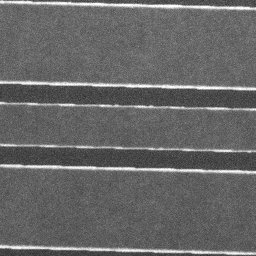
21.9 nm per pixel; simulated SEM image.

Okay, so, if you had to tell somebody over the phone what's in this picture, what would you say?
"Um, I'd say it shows lines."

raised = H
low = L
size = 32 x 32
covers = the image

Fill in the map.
HHHHHHHHHHHHLLLLLLLLLLLLLLLLLLLL
HHHHHHHHHHHHHHHHHHHHHHHHHHHHHHHH
HHHHHHHHHHHHHHHHHHHHHHHHHHHHHHHH
HHHHHHHHHHHHHHHHHHHHHHHHHHHHHHHH
HHHHHHHHHHHHHHHHHHHHHHHHHHHHHHHH
HHHHHHHHHHHHHHHHHHHHHHHHHHHHHHHH
HHHHHHHHHHHHHHHHHHHHHHHHHHHHHHHH
HHHHHHHHHHHHHHHHHHHHHHHHHHHHHHHH
HHHHHHHHHHHHHHHHHHHHHHHHHHHHHHHH
HHHHHHHHHHHHHHHHHHHHHHHHHHHHHHHH
LLLLLLLLHHHHHHHHHHHHHHHHHHHHHHHH
LLLLLLLLLLLLLLLLLLLLLLLLLLLLLLLL
LLLLLLLLLLLLLLLLLLLLLLLLLLLLLLLL
HHHHHHHHHHHHHHHHHHHHHHLLLLLLLLLL
HHHHHHHHHHHHHHHHHHHHHHHHHHHHHHHH
HHHHHHHHHHHHHHHHHHHHHHHHHHHHHHHH
HHHHHHHHHHHHHHHHHHHHHHHHHHHHHHHH
HHHHHHHHHHHHHHHHHHHHHHHHHHHHHHHH
LLLLLLLLLLLLLLHHHHHHHHHHHHHHHHHH
LLLLLLLLLLLLLLLLLLLLLLLLLLLLLLLL
LLLLLLLLLLLLLLLLLLLLLLLLLLLLLLLL
HHHHHHHHHHHHHHHHHHHHHHHHHHHHHHHH
HHHHHHHHHHHHHHHHHHHHHHHHHHHHHHHH
HHHHHHHHHHHHHHHHHHHHHHHHHHHHHHHH
HHHHHHHHHHHHHHHHHHHHHHHHHHHHHHHH
HHHHHHHHHHHHHHHHHHHHHHHHHHHHHHHH
HHHHHHHHHHHHHHHHHHHHHHHHHHHHHHHH
HHHHHHHHHHHHHHHHHHHHHHHHHHHHHHHH
HHHHHHHHHHHHHHHHHHHHHHHHHHHHHHHH
HHHHHHHHHHHHHHHHHHHHHHHHHHHHHHHH
HHHHHHHHHHHHHHHHHHHHHHHHHHHHHHHH
LLLLLLLLLLLLLLLLLLLLLHHHHHHHHHHH